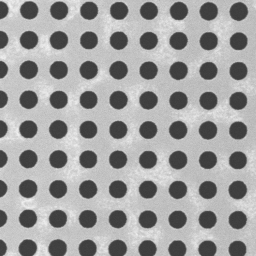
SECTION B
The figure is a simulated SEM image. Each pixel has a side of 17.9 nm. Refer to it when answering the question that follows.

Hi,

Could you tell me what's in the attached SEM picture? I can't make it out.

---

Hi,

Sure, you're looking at a regular array of holes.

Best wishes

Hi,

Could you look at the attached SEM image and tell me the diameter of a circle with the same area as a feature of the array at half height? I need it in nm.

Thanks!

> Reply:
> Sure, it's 331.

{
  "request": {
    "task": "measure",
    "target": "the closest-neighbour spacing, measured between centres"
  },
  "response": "29.6 pixels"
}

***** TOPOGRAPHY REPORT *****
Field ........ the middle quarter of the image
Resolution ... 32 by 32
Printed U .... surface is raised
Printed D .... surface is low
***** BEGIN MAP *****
DUUUDDDDUUUUDDDDUUUDDDDUUUUDDDDU
DUUUDDDDDUUDDDDDUUUDDDDDUUDDDDDU
DUUUDDDDUUUDDDDDUUUDDDDUUUDDDDDU
UUUUUDDUUUUUDDDUUUUUDDDUUUUDDDUU
UUUUUUUUUUUUUUUUUUUUUUUUUUUUUUUU
UUUUUUUUUUUUUUUUUUUUUUUUUUUUUUUU
UUUUUUUUUUUUUUUUUUUUUUUUUUUUUUUU
DUUUDDDDUUUUDDDUUUUUDDDUUUUDDDUU
DUUUDDDDDUUDDDDDUUUDDDDUUUDDDDDU
DUUUDDDDUUUDDDDDUUUDDDDUUUDDDDDU
UUUUDDDDUUUUDDDUUUUDDDDUUUUDDDDU
UUUUUUUUUUUUUUUUUUUUUUUUUUUUUUUU
UUUUUUUUUUUUUUUUUUUUUUUUUUUUUUUU
UUUUUUUUUUUUUUUUUUUUUUUUUUUUUUUU
UUUUUDDUUUUUUDDUUUUUDDUUUUUDDDUU
DUUUDDDDUUUDDDDDUUUDDDDUUUUDDDDU
DUUUDDDDUUUDDDDDUUUDDDDUUUDDDDDU
DUUUDDDDUUUDDDDDUUUDDDDUUUDDDDDU
UUUUUDDUUUUUDDDUUUUUDDUUUUUDDDUU
UUUUUUUUUUUUUUUUUUUUUUUUUUUUUUUU
UUUUUUUUUUUUUUUUUUUUUUUUUUUUUUUU
UUUUUUUUUUUUUUUUUUUUUUUUUUUUUUUU
DUUUDDDDUUUUDDDUUUUDDDDUUUUDDDUU
DUUUDDDDUUUDDDDDUUUDDDDUUUDDDDDU
DUUUDDDDUUUDDDDDUUUDDDDUUUDDDDDU
UUUUDDDDUUUUDDDUUUUDDDDUUUUDDDUU
UUUUUUUUUUUUUUUUUUUUUUUUUUUUDUUU
UUUUUUUUUUUUUUUUUUUUUUUUUUUUUUUU
UUUUUUUUUUUUUUUUUUUUUUUUUUUUUUUU
UUUUUDDUUUUUDDDUUUUUDDUUUUUDDDUU
DUUUDDDDUUUDDDDDUUUDDDDUUUDDDDDU
DUUUDDDDUUUDDDDDUUUDDDDUUUDDDDDU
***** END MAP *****